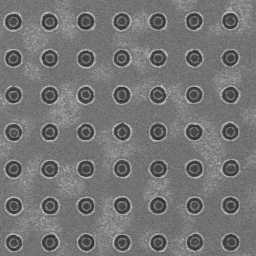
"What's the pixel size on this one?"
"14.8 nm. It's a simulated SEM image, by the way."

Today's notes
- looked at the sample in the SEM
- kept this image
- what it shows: a regular array of ring-shaped grooves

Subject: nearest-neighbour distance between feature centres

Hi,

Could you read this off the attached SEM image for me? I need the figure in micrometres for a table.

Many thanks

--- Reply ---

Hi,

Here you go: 0.531